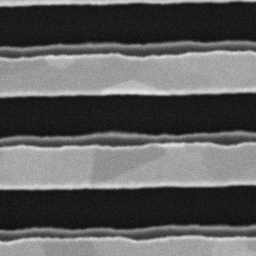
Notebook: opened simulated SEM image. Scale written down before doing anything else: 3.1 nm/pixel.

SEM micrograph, lines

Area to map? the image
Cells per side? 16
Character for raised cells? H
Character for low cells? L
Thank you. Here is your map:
LLLLLLLLLLLLLLLL
LLLLLLLLLLLLLLLL
LLLLLLLLLLLLLLLL
HHHHHHHHHHHHHHHH
HHHHHHHHHHHHHHHH
HHHHHHHHHHHHHHHH
LLLLLLLLLLLLLLLL
LLLLLLLLLLLLLLLL
LLLLLLHHHLLHHHHH
HHHHHHHHHHHHHHHH
HHHHHHHHHHHHHHHH
HHHHHHHHHHHHHHHH
LLLLLLLLLLLLLLLL
LLLLLLLLLLLLLLLL
HHHHHHHHHHHHHHHH
HHHHHHHHHHHHHHHH